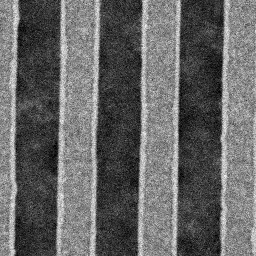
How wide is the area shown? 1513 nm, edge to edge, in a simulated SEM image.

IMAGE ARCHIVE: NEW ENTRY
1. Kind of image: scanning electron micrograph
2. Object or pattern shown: one or a few lines or trenches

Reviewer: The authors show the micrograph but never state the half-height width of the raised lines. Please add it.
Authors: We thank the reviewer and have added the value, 0.199 um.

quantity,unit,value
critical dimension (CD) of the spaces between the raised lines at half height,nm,280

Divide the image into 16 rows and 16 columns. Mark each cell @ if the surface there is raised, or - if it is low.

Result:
@---@@---@@---@@
@---@@---@@---@@
@---@@---@@---@@
@---@@---@@---@@
@---@@---@@---@@
@---@@---@@---@@
@---@@---@@---@@
@---@@---@@---@@
@---@@---@@---@@
@---@@---@@---@@
@---@@---@@---@@
@---@@---@@---@@
@---@@---@@---@@
@---@@---@@---@@
@---@@---@@---@@
@---@@---@@---@@